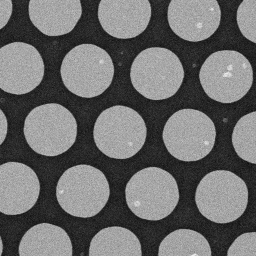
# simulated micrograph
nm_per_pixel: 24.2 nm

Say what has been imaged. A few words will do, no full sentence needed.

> an array of small figures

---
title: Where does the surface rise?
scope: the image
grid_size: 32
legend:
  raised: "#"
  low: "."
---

#...######..#######..######...##
#...######..#######..#######..##
#...######..#######..######...##
.....####....#####...######...##
..............###.....####.....#
.##.............................
#####....####.....###......###..
#####...######...#####....#####.
#####...######..#######..######.
#####...######..#######..#######
#####...######...######..######.
.###.....####....#####....#####.
...........................###..
....####......##................
#..######...######...#####.....#
#..#######..######...######...##
#..#######..######..#######..###
...######...######..#######..###
....#####...######...######..###
.............###......####....##
.##.............................
####....#####....####......##...
#####..######...######...#####..
#####..#######..######...######.
#####..#######..######..#######.
####...######...######...######.
###.....####.....####....#####..
..........................###...
....####.....##.................
...#####....#####....####.....##
...######..######...######...###
..#######..#######..######..####